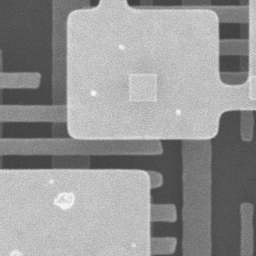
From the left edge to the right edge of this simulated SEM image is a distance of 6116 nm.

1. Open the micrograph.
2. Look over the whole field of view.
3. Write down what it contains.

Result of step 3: wiring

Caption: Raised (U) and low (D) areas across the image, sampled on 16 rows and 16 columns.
DDDDDDUUDDDDDDDD
DDDDUUUUUUUUUUDD
DDDDUUUUUUUUUUDD
DDDDUUUUUUUUUUDD
DDDDUUUUUUUUUUDD
DDDDUUUUUUUUUUUU
DDDDUUUUUUUUUUUU
DDDDUUUUUUUUUUDD
DDDDDUUUUUUUUDDD
DDDDDDDDDDDDDDDD
DDDDDDDDDDDDDDDD
UUUUUUUUUDDDDDDD
UUUUUUUUUDDDDDDD
UUUUUUUUUDDDDDDD
UUUUUUUUUDDDDDDD
UUUUUUUUUDDDDDDD